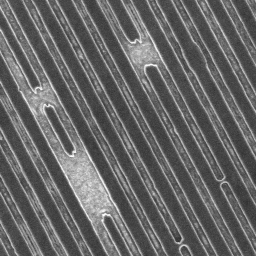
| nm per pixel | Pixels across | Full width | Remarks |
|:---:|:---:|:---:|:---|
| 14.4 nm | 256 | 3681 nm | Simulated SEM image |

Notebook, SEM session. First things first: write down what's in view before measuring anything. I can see parallel lines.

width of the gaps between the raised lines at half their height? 110 nanometers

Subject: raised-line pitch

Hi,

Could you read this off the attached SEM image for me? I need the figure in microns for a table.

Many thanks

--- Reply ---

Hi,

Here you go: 0.316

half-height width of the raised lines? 208 nm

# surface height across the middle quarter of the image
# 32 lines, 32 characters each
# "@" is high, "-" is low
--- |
-@@@@--@@@@--@@@@---@@@--@@@@--@
-@@@@--@@@@---@@@---@@@@--@@@@--
--@@@@--@@@@--@@@@--@@@@---@@@@-
--@@@@--@@@@@--@@@@--@@@@--@@@@-
@--@@@@--@@@@--@@@@--@@@@---@@@@
@--@@@@--@@@@@--@@@@--@@@@--@@@@
@@--@@@@--@@@@--@@@@--@@@@---@@@
@@--@@@@--@@@@@--@@@@--@@@@--@@@
@@@--@@@@--@@@@--@@@@--@@@@---@@
@@@--@@@@---@@@@--@@@@--@@@@--@@
@@@@--@@@@--@@@@--@@@@---@@@@--@
@@@@---@@@---@@@@--@@@@--@@@@--@
-@@@@--@@@@--@@@@--@@@@---@@@@--
-@@@@--@@@@---@@@@--@@@@--@@@@--
--@@@@--@@@@--@@@@--@@@@---@@@@-
--@@@@--@@@@---@@@@--@@@@--@@@@-
---@@@@--@@@@--@@@@--@@@@---@@@-
@--@@@@--@@@@---@@@@--@@@@--@@@@
@---@@@@--@@@@--@@@@@--@@@@--@@@
@@---@@@@--@@@@--@@@@--@@@@--@@@
@@@--@@@@--@@@@--@@@@@--@@@@--@@
@@@--@@@@---@@@@--@@@@--@@@@--@@
-@@---@@@@--@@@@--@@@@@--@@@@--@
------@@@@@--@@@@--@@@@--@@@@--@
-------@@@@--@@@@--@@@@@--@@@@--
--------@@@@--@@@@--@@@@--@@@@--
--------@@@@--@@@@---@@@@--@@@@-
---------@@@@--@@@@--@@@@--@@@@@
@--------@@@@---@@@---@@@@--@@@@
@---------@@@@--@@@@--@@@@--@@@@
@@--------@@@@--@@@@---@@@@--@@@
@@---------@@@@--@@@@--@@@@--@@@